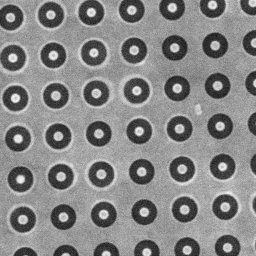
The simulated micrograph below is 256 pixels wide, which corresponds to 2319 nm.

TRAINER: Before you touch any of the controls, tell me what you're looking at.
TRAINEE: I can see an array of small figures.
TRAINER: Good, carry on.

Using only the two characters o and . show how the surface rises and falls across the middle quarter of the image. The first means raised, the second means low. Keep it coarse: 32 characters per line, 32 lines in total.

oooooo....oooooooooooooooooooooo
oooooooooooooooooooooooooooooooo
oooooooooooooooooooooooooooooooo
oooooooooooooooo....oooooo....oo
oooooo.....oooo......oooo......o
.oooo.......oo........ooo...o...
.oooo..oo...oo...oo...ooo..oo...
..oo...oo...oo........ooo......o
.oooo.......ooo......ooooo.....o
.oooo......ooooo.....ooooooo.ooo
ooooooo...oooooooooooooooooooooo
oooooooooooooooooooooooooooooooo
oooooooooooooooooooooooooooooooo
oooooooooooooooooo..ooooooo....o
ooooooo...oooooo.....ooooo......
.ooooo.....ooooo......ooo...oo..
..ooo.......ooo...oo..ooo...oo..
..ooo...oo..ooo...o...oooo......
..oooo..o...oooo......oooo.....o
..oooo.....oooooo....ooooooo..oo
.oooooo...oooooooooooooooooooooo
oooooooooooooooooooooooooooooooo
oooooooooooooooooooooooooooooooo
oooooooooooooooooooooooooooo...o
oooooooo...oooooo.....ooooo.....
..oooo......oooo......oooo...o..
...ooo.......ooo...o...ooo...o..
...oo...oo...ooo...o...ooo......
...ooo...o...ooo......ooooo.....
...ooo......ooooo.....oooooo....
..ooooo.....oooooooooooooooooooo
oooooooooooooooooooooooooooooooo